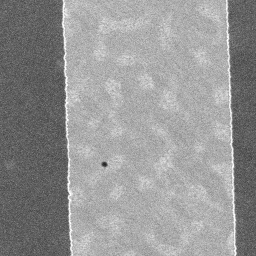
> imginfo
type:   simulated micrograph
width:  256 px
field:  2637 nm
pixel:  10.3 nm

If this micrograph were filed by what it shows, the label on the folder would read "one or a few lines or trenches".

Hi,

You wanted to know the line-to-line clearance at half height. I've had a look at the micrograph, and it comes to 1680 nm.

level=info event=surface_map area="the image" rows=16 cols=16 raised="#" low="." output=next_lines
####..........##
####..........##
####..........##
####..........##
####..........##
####..........##
####..........##
####..........##
####..........##
####..........##
####...........#
####...........#
####...........#
####...........#
####...........#
####...........#